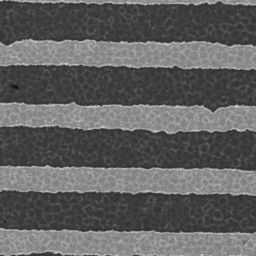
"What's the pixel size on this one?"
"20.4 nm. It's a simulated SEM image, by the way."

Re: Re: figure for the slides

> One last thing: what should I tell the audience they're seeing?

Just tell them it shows one or a few lines or trenches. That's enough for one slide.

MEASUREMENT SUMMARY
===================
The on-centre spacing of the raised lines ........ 1290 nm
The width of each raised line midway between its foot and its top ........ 0.485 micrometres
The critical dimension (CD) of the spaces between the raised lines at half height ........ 802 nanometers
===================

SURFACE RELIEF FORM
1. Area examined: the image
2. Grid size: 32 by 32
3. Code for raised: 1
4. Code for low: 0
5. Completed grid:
00000000000010000111000010000011
00000000000000000000000000000000
00000000000000000000000000000000
00000000000000000000000000000000
00000000000000000000000000000000
01111111111111111111111111110000
11111111111111111111111111111111
11111111111111111111111111111111
00000000000000000000000101111111
00000000000000000000000000000000
00000000000000000000000000000000
00000000000000000000000000000000
00000000000000000000000000000000
11111111111111111111111111001111
11111111111111111111111111111111
11111111111111111111111111111111
00000000000000000000010000000000
00000000000000000000000000000000
00000000000000000000000000000000
00000000000000000000000000000000
00000000000000000000000000000000
11111111111111111111111111111111
11111111111111111111111111111111
11111111111111111111111111111111
00000000000000000000000000000000
00000000000000000000000000000000
00000000000000000000000000000000
00000000000000000000000000000000
00000000000000000000000000000000
11111111111111111111111111111111
11111111111111111111111111111111
11111111111111111111111111111111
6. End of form